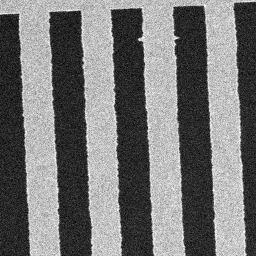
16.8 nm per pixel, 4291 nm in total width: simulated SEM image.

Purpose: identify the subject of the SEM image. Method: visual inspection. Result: one or a few lines or trenches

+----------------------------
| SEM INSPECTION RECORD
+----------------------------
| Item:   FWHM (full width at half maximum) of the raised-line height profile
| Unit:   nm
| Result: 492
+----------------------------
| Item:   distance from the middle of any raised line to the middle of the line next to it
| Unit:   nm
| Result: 1040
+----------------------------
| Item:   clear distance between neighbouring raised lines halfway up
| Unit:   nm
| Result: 548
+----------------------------